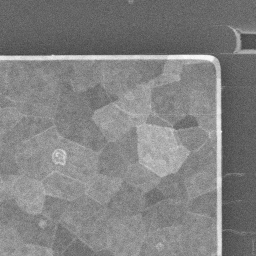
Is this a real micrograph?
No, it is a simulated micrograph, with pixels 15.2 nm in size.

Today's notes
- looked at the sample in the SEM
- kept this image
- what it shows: wiring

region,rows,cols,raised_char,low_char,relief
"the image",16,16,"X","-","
----------------
----------------
----------------
----------------
XXXXXXXXXXXXXX--
XXXXXXXXXXXXXX--
XXXXXXXXXXXXXX--
XXXXXXXXXXXXXX--
XXXXXXXXXXXXXX--
XXXXXXXXXXXXXX--
XXXXXXXXXXXXXX--
XXXXXXXXXXXXXX--
XXXXXXXXXXXXXX--
XXXXXXXXXXXXXX--
XXXXXXXXXXXXXX--
XXXXXXXXXXXXXX--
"